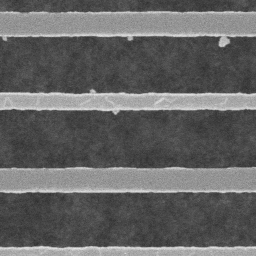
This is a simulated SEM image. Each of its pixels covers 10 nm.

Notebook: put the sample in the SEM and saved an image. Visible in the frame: lines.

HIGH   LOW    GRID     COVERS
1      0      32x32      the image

00000000000000000000000000000000
00000000000000000000000000000000
11111111111111111111111111111111
11111111111111111111111111111111
00000000000000000000000000000000
00000000000000000000000000000000
00000000000000000000000000000000
00000000000000000000000000000000
00000000000000000000000000000000
00000000000000000000000000000000
00000000000000000000000000000000
00000000000000000000000000000000
11111111111111111111111111111111
11111111111111111111111111111111
00000000000000000000000000000000
00000000000000000000000000000000
00000000000000000000000000000000
00000000000000000000000000000000
00000000000000000000000000000000
00000000000000000000000000000000
00000000000000000000000000000000
11111111111111111111111111111111
11111111111111111111111111111111
11111111111111111111111111111111
00000000000000000000000000000000
00000000000000000000000000000000
00000000000000000000000000000000
00000000000000000000000000000000
00000000000000000000000000000000
00000000000000000000000000000000
00000000000000000000000000000000
11111111111111111111111111111111